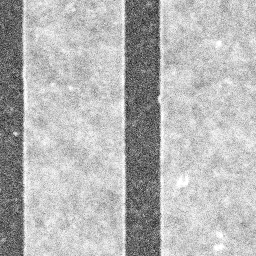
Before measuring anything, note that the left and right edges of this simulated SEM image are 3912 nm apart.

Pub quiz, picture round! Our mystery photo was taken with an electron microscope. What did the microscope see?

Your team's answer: one or a few lines or trenches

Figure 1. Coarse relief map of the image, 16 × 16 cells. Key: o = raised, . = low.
..oooooo..oooooo
..oooooo..oooooo
..oooooo..oooooo
..oooooo..oooooo
..oooooo..oooooo
..oooooo..oooooo
..oooooo..oooooo
..oooooo..oooooo
..oooooo..oooooo
..oooooo..oooooo
..oooooo..oooooo
..oooooo..oooooo
..oooooo..oooooo
..oooooo..oooooo
..oooooo..oooooo
..oooooo..oooooo